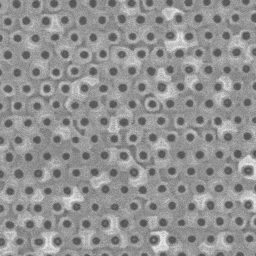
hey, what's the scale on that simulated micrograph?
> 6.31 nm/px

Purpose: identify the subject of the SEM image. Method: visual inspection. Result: a regular array of holes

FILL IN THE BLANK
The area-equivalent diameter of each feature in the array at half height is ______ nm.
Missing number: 53.8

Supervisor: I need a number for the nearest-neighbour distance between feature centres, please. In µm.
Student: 0.117